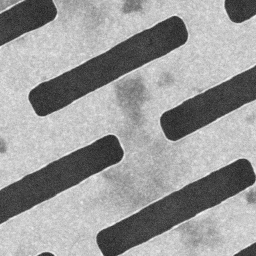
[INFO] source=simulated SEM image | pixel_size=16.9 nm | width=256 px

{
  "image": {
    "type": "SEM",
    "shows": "holes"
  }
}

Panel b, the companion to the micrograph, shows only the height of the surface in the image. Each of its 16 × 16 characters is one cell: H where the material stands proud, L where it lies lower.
HLLHHHHHHHHHHHLL
LLLHHHHHHHLLHHHH
LHHHHHHHLLLLHHHH
HHHHHHLLLLHHHHHH
HHHHLLLLHHHHHHHL
HHLLLLHHHHHHHLLL
HHLLHHHHHHHLLLLH
HHHHHHHHHHLLLLHH
HHHHHHHHHHLLHHHH
HHHHHLLLHHHHHHHH
HHHLLLLHHHHHHHLL
HLLLLHHHHHHHLLLL
LLLHHHHHHHLLLLHH
LHHHHHHHLLLLHHHH
HHHHHHLLLLHHHHHH
HHHHHHLLHHHHHHHL